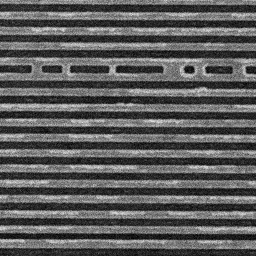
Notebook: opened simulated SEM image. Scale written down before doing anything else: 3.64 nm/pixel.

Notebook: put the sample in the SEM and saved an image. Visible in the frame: parallel lines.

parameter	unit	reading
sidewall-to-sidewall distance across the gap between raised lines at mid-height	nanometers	29.1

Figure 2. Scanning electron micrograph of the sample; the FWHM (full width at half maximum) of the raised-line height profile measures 25.5 nm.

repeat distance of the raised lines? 0.0553 microns